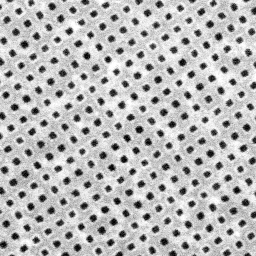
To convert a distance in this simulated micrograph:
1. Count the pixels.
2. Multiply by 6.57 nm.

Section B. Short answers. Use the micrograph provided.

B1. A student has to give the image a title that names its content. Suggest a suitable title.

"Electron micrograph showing a regular array of holes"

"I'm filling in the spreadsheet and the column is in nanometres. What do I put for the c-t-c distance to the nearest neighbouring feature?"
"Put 96.2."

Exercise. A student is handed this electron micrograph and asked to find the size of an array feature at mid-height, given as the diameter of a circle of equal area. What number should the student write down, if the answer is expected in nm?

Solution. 56.9